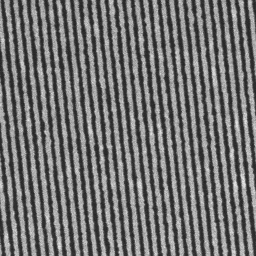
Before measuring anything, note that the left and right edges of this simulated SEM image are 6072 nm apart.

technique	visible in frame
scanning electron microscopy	parallel lines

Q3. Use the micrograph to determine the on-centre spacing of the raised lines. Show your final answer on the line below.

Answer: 0.204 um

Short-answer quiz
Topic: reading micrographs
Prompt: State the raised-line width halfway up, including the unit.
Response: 139 nanometres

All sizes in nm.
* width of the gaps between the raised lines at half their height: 70.7